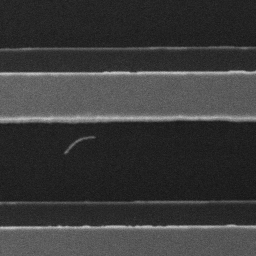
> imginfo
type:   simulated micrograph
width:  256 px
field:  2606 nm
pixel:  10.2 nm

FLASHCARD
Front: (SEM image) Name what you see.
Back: lines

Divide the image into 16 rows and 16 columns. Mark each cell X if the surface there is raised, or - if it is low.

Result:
----------------
----------------
----------------
XXXXXXXXXXXXXXXX
XXXXXXXXXXXXXXXX
XXXXXXXXXXXXXXXX
XXXXXXXXXXXXXXXX
X---------------
----------------
----------------
----------------
----------------
----------------
XXXXXXXXXXXXXXXX
XXXXXXXXXXXXXXXX
XXXXXXXXXXXXXXXX